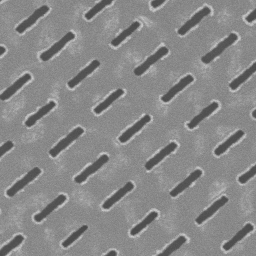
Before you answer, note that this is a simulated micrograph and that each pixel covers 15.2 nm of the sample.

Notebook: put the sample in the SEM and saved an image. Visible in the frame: a regular array of holes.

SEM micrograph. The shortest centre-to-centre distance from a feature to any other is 567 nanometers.